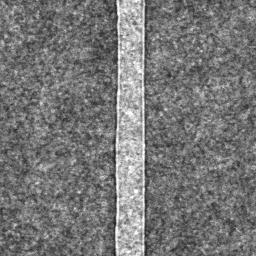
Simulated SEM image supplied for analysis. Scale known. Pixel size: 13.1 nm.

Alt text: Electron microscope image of one or a few lines or trenches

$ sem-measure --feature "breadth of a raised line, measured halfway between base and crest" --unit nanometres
336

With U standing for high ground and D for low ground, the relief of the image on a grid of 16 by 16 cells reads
DDDDDDDUUDDDDDDD
DDDDDDDUUDDDDDDD
DDDDDDDUUDDDDDDD
DDDDDDDUUDDDDDDD
DDDDDDDUUDDDDDDD
DDDDDDDUUDDDDDDD
DDDDDDDUUDDDDDDD
DDDDDDDUUDDDDDDD
DDDDDDDUUDDDDDDD
DDDDDDDUUDDDDDDD
DDDDDDDUUDDDDDDD
DDDDDDDUUDDDDDDD
DDDDDDDUUDDDDDDD
DDDDDDDUUDDDDDDD
DDDDDDDUUDDDDDDD
DDDDDDDUUDDDDDDD